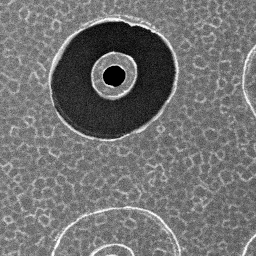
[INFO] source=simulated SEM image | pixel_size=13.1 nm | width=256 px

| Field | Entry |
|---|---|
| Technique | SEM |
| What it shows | ring-shaped grooves with a dot in the middle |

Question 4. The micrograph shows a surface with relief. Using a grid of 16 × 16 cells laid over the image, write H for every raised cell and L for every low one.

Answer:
HHHHHHHHHHHHHHHH
HHHHHHLLHHHHHHHH
HHHHLLLLLLHHHHHH
HHHHLLHHLLLHHHHH
HHHLLLHLHLLHHHHH
HHHLLLHHLLLHHHHH
HHHLLLLLLLHHHHHH
HHHHLLLLLLHHHHHH
HHHHHLLLHHHHHHHH
HHHHHHHHHHHHHHHH
HHHHHHHHHHHHHHHH
HHHHHHHHHHHHHHHH
HHHHHHHHHHHHHHHH
HHHHHHHHHHHHHHHH
HHHHHHHHHHHHHHHH
HHHHHHHHHHHHHHHH